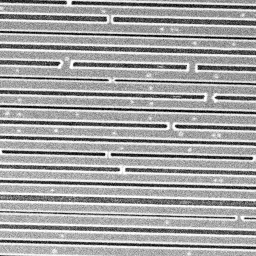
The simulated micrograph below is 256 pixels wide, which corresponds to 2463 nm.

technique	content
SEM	parallel lines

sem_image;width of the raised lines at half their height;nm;95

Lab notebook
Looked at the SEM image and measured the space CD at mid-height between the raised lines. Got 0.0469 micrometres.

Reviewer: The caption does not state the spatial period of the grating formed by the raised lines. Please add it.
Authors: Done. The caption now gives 145 nm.